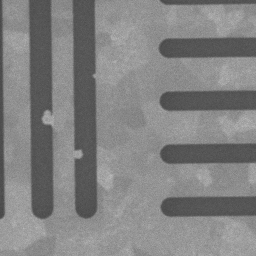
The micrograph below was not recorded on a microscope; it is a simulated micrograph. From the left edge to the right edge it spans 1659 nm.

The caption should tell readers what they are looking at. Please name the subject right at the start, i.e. groups of lines, slits or small figures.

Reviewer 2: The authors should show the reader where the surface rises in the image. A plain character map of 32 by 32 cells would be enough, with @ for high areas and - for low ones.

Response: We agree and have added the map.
@@@@--@@@---@@@@@@@@------------
@@@@--@@@---@@@@@@@@@@@@@@@@@@@@
@@@@--@@@---@@@@@@@@@@@@@@@@@@@@
@@@@--@@@---@@@@@@@@@@@@@@@@@@@@
@@@@--@@@---@@@@@@@@@@@@@@@@@@@@
@@@@--@@@---@@@@@@@@------------
@@@@---@@---@@@@@@@@------------
@@@@---@@---@@@@@@@@@@@@@@@@@@@@
@@@@---@@---@@@@@@@@@@@@@@@@@@@@
@@@@---@@---@@@@@@@@@@@@@@@@@@@@
@@@@---@@---@@@@@@@@@@@@@@@@@@@@
@@@@---@@---@@@@@@@@@-----------
@@@@---@@---@@@@@@@@------------
-@@@---@@---@@@@@@@@------------
-@@@--@@@---@@@@@@@@@@@@@@@@@@@@
-@@@--@@@---@@@@@@@@@@@@@@@@@@@@
-@@@---@@---@@@@@@@@@@@@@@@@@@@@
-@@@---@@---@@@@@@@@@@@@@@@@@@@@
-@@@---@@---@@@@@@@@------------
-@@@---@@---@@@@@@@@------------
-@@@---@@---@@@@@@@@@-@@@@@@@@@@
-@@@---@@---@@@@@@@@@@@@@@@@@@@@
-@@@---@@---@@@@@@@@@@@@@@@@@@@@
-@@@---@@---@@@@@@@@@@@@@@@@@@@@
-@@@---@@---@@@@@@@@@@@@@@@@@@@@
-@@@---@@---@@@@@@@@------------
-@@@---@@---@@@@@@@@------------
@@@@@@@@@@@@@@@@@@@@@@@@@@@@@@@@
@@@@@@@@@@@@@@@@@@@@@@@@@@@@@@@@
@@@@@@@@@@@@@@@@@@@@@@@@@@@@@@@@
@@@@@@@@@@@@@@@@@@@@@@@@@@@@@@@@
@@@@@@@@@@@@@@@@@@@@@@@@@@@@@@@@